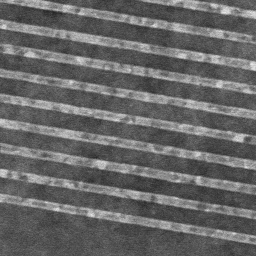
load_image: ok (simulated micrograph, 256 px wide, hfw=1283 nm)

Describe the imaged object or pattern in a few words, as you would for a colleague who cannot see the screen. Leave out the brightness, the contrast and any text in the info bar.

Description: parallel lines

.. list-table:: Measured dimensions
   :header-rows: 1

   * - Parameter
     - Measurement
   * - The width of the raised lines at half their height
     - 33.4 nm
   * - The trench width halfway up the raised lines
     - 92.7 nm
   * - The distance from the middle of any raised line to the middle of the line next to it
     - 123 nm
